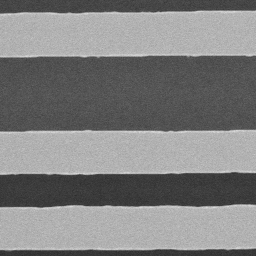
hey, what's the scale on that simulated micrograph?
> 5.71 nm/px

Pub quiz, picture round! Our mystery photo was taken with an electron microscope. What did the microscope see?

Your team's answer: lines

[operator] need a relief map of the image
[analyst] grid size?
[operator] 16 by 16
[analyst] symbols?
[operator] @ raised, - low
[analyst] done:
----------------
@@@@@@@@@@@@@@@@
@@@@@@@@@@@@@@@@
@@@--@----------
----------------
----------------
----------------
----------------
@@@@@@@@@@@@@@@@
@@@@@@@@@@@@@@@@
@@@@@@@@@@@@@@@@
----------------
----------------
@@@@@@@@@@@@@@@@
@@@@@@@@@@@@@@@@
@@@@@@@@@@@@@@@@